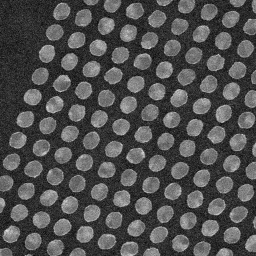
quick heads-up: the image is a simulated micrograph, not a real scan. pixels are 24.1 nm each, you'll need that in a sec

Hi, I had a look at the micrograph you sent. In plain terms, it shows a regular array of raised bodies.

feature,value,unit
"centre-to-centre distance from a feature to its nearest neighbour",22.4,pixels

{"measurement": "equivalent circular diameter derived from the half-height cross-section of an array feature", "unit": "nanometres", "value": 392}